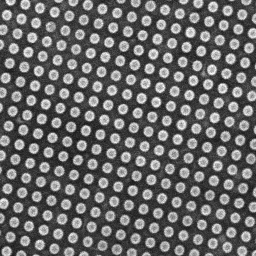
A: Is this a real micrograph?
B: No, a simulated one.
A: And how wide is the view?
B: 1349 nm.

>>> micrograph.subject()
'a regular array of raised bodies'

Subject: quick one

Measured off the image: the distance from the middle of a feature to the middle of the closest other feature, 0.0793 µm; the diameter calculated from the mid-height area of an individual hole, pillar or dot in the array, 51.9 nm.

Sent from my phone